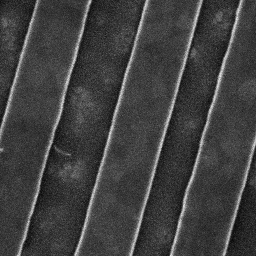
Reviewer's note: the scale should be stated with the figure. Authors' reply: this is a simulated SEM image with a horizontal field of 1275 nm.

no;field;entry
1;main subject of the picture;one or a few lines or trenches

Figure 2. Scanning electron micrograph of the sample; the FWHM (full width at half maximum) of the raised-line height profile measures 264 nanometers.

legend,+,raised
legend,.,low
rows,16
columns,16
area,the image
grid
..++++...+++...+
..+++....+++...+
..+++...++++..++
.++++...++++..++
.+++....+++...++
.+++....+++...++
.+++...++++..+++
++++...++++..+++
+++....+++...+++
+++....+++..++++
+++...++++..++++
++....+++...+++.
++....+++...+++.
++...++++..++++.
++...++++..+++..
+....+++...+++..